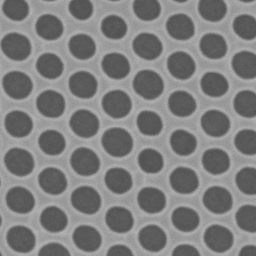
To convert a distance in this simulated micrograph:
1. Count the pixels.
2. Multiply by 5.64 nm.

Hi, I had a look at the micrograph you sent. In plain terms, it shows a regular array of holes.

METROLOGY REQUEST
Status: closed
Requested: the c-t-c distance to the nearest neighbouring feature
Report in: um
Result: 0.212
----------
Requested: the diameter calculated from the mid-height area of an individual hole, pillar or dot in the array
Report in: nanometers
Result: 160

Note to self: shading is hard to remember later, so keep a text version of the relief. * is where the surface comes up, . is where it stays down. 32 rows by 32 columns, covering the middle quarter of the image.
*********........*********......
**********.......**...****......
**.....***......**......***.....
*.......***....**.......****...*
*.......*********........*******
*.......*********........*******
*.......****..***........*******
**......**......**......***.....
****...***.......***...***......
*********........*********......
*********........*********......
***...****.......*********......
**......***.....***....****.....
**......****..****......********
*........*********.......*******
*........*********.......*******
**.......*.....****.....****..**
***.....**.......***....***.....
*****.***........*********......
*********........*********......
**********.......**********.....
***....***.......***...****.....
**......***.....***.....****....
**.......*********.......*******
**.......*********.......*******
**.......**********......*******
**.......**.....****....***.....
***.....**.......**********.....
.*********.......*********......
.*********.......*********......
.***..*****......**********.....
**......***.....***.....***.....